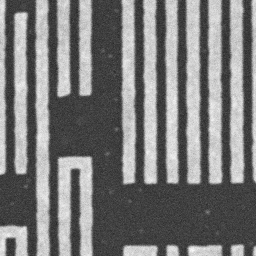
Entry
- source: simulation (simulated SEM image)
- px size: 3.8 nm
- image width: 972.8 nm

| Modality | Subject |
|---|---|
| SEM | wiring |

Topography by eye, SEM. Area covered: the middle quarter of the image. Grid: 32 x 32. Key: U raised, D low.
UDDDUUUDDDDDDDDUUDDDUUUDDDUUDDDU
UDDDUUUDDDDDDDDUUDDDUUUDDDUUDDDU
UDDDUUDDDDDDDDDUUDDDUUUDDDUUDDDU
UDDDUUDDDDDDDDDUUDDDUUUDDDUUDDDU
UDDDUUDDDDDDDDDUUDDDUUUDDDUUDDDU
UDDDUUDDDDDDDDDUUDDDUUUDDDUUDDDU
UDDDUUDDDDDDDDDUUDDDUUUDDDUUDDDU
UDDDUUDDDDDDDDDUUDDDUUUDDDUUDDDU
DDDDDDDDDDDDDDDUUDDDUUUDDDUUDDDU
DDDDDDDDDDDDDDDUUDDDUUUDDDUUDDDU
DDDDDDDDDDDDDDDUUDDDUUUDDDUUDDDU
DDDDDDDDDDDDDDDUUDDDUUUDDDUUDDDU
DDDDDDDDDDDDDDDUUDDDUUUDDDUUDDDU
DDDDDDDDDDDDDDDUUDDDUUUDDDUUDDDU
DDDDDDDDDDDDDDDUUDDDUUUDDDUUDDDU
DDDDDDDDDDDDDDDUUDDDUUUDDDUUDDDU
DDDDDDDDDDDDDDDUUDDDUUUDDDUUDDDU
DDDDDDDDDDDDDDDUUUDDUUUDDDUUDDDU
DDDDDDDDDDDDDDDUUUDDUUUDDDUUDDDU
DDDDDDDDDDDDDDDUUDDDUUUDDDUUDDDU
DDDDDDDDDDDDDDDUUDDDUUUDDDUUDDDU
DDDDDDDDDDDDDDDUUDDDUUUDDDUUDDDU
DDDDDDDDDDDDDDDUUDDDUUUDDDUUDDDU
DDDDDDDDDDDDDDDUUDDDUUUDDDUUDDDU
UUUUUUUDDDDDDDDUUDDDUUUDDDUUDDDU
UUUUUUUDDDDDDDDUUDDDUUUDDDUUDDDU
UUDDUUUDDDDDDDDUUDDDUUUDDDUUDDDU
UDDDUUUDDDDDDDDUUDDDUUUDDDUUDDDU
UDDDUUUDDDDDDDDUUDDDUUUDDDUUDDDU
UDDDUUUDDDDDDDDUUDDDUUUDDDUUDDDU
UDDDUUUDDDDDDDDDDDDDDDDDDDDDDDDD
UDDDUUUDDDDDDDDDDDDDDDDDDDDDDDDD